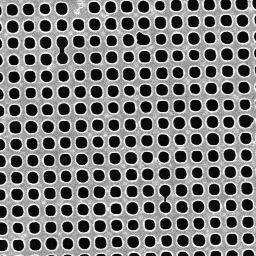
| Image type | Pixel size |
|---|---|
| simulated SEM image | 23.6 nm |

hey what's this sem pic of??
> a regular array of holes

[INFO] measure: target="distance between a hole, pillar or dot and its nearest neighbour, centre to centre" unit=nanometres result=381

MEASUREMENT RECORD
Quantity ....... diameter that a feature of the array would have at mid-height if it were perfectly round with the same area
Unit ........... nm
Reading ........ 277